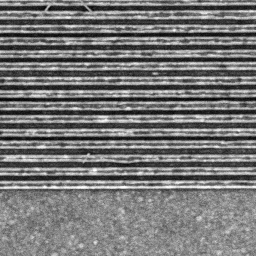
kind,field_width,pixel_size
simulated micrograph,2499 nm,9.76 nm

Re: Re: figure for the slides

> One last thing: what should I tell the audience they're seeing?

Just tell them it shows parallel lines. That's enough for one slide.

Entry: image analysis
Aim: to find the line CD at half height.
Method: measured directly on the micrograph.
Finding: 58.6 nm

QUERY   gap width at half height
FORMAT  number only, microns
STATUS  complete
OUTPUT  0.0671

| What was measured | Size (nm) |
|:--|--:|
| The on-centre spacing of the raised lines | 127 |